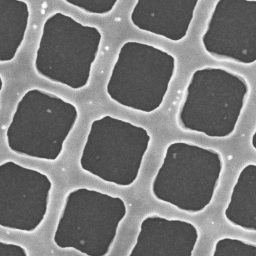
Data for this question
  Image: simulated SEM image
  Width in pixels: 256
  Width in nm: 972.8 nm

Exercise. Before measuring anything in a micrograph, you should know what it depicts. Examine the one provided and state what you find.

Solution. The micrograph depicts holes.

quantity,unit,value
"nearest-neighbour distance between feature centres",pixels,77.8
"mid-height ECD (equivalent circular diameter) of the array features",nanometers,253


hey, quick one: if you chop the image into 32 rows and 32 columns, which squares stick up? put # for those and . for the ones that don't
...######.....###........##.....
....#######..####.......###.....
...###...########.......##......
...##.......#####.......##......
...##........#######...##.......
..###.......####..#######.......
..###.......###......#####......
.####.......###.......#######...
#####......###........####.#####
######.....###.......###......##
########...##........###.......#
####.########........##........#
###.....######......###.......##
##.......########...###.......##
##........############........##
#........###....#######......###
#........##.......#######....###
#.......###........#############
#.......##........###....#######
####...###........###......#####
..########........##........####
.....######......###........##..
......#######....##........###..
......#############........##...
......###.....######.......##...
......##.......######.....###...
......##........############....
.....##........###...########...
#...###........###......######..
#######.......###........#######
.######.......###.......###....#
...#######...###........###.....